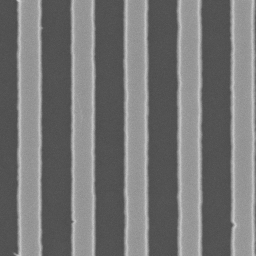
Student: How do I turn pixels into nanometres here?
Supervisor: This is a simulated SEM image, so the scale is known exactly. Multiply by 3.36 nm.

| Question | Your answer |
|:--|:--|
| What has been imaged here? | parallel lines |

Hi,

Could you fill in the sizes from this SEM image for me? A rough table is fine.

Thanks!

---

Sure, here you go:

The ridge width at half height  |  21.8 pixels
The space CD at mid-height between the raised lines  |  31.8 pixels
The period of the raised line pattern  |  179 nm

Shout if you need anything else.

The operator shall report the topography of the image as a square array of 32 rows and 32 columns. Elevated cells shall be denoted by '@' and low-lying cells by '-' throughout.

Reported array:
--@@@----@@@----@@----@@@----@@@
--@@@----@@@----@@----@@@----@@@
--@@@----@@@----@@----@@@----@@@
--@@@----@@@----@@----@@@----@@@
--@@@----@@@----@@----@@@----@@@
--@@@----@@@----@@----@@@----@@@
--@@@----@@@----@@----@@@----@@@
--@@@----@@@----@@----@@@----@@@
--@@@----@@@----@@----@@@----@@@
--@@@----@@@----@@----@@@----@@@
--@@@----@@@----@@----@@@----@@@
--@@@----@@@----@@----@@@----@@@
--@@@----@@@----@@----@@@----@@@
--@@@----@@@----@@----@@@----@@@
--@@@----@@@----@@----@@@----@@@
--@@@----@@@----@@----@@@----@@@
--@@@----@@@----@@----@@@----@@@
--@@@----@@@----@@----@@@----@@@
--@@@----@@@----@@----@@@----@@@
--@@@----@@@----@@----@@@----@@@
--@@@----@@@----@@----@@@----@@@
--@@@----@@@----@@----@@@----@@@
--@@@----@@@----@@----@@@----@@@
--@@@----@@@----@@-----@@----@@@
--@@@----@@@----@@----@@@----@@@
--@@@----@@@----@@----@@@----@@@
--@@@----@@@----@@-----@@----@@@
--@@@----@@@----@@-----@@----@@@
--@@@----@@@----@@----@@@----@@@
--@@@----@@@----@@----@@@----@@@
--@@@----@@@----@@----@@@----@@@
--@@@----@@@----@@-----@@----@@@